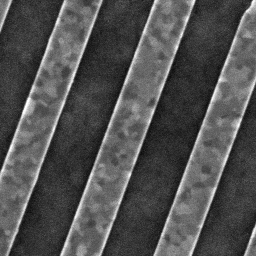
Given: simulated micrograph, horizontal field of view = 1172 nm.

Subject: one or a few lines or trenches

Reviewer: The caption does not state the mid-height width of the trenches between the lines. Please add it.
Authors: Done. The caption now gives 229 nm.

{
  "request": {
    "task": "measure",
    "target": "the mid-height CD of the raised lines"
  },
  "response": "162 nm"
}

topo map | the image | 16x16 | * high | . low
*...**....**....
...***...***...*
...**....**....*
...**...***...**
..***...***...**
..**....**....**
..**...***...**.
.***...**....**.
.**....**...***.
.**...***...**..
***...**....**..
**...***...***..
**...***...**...
*....**....**...
*...***...**....
*...**....**...*